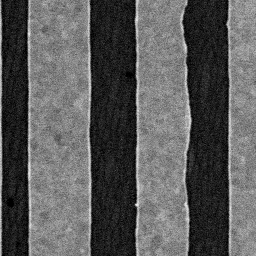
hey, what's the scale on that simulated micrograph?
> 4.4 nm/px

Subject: one or a few lines or trenches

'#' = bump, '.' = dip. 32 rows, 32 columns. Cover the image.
....#######......######......###
....#######......######......###
....#######......######......###
....#######......######......###
....#######......######......###
....#######......######......###
....#######......######......###
....#######......######......###
....#######......######......###
....#######......######......###
....#######......######......###
....#######......######......###
....#######......#######.....###
....#######......#######.....###
....#######......#######.....###
....#######......#######.....###
....#######......#######.....###
....#######......#######.....###
....#######......######......###
....#######......######......###
....#######......######......###
....#######......######......###
....#######......######......###
....#######......######......###
....#######......######......###
....#######......######......###
....#######......######......###
....#######......######......###
....#######......#######.....###
....#######......######......###
....#######......#######.....###
....#######......######......###